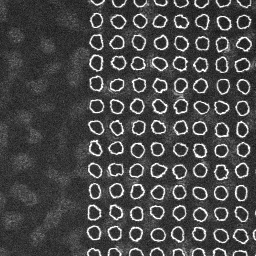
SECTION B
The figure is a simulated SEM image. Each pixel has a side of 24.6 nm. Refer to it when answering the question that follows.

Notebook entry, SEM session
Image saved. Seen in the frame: a regular array of raised bodies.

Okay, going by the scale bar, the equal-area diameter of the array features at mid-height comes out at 330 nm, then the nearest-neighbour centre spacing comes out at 497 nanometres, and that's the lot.